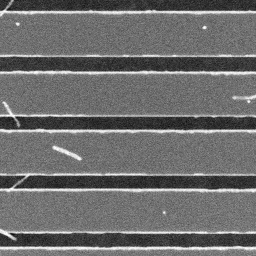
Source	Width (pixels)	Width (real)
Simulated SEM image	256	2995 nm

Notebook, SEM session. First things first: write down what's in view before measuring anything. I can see lines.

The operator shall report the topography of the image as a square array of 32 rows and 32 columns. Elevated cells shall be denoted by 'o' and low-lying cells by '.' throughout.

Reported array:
................................
ooo.ooooooooo..ooooooooooooooooo
oooooooooooooooooooooooooooooooo
oooooooooooooooooooooooooooooooo
oooooooooooooooooooooooooooooooo
oooooooooooooooooooooooooooooooo
oooooooooooooooooooooooooooooooo
................................
................................
oooooooooooooooooooooooooooooooo
oooooooooooooooooooooooooooooooo
oooooooooooooooooooooooooooooooo
oooooooooooooooooooooooooooooooo
oooooooooooooooooooooooooooooooo
.o.............................o
................................
oooooooooooooooooooooooooooooooo
oooooooooooooooooooooooooooooooo
oooooooooooooooooooooooooooooooo
oooooooooooooooooooooooooooooooo
oooooooooooooooooooooooooooooooo
oooooooooooooooooooooooooooooooo
................................
................................
oooooooooooooooooooooooooooooooo
oooooooooooooooooooooooooooooooo
oooooooooooooooooooooooooooooooo
oooooooooooooooooooooooooooooooo
oooooooooooooooooooooooooooooooo
................................
................................
oooooooooooooooooooooooooooooooo